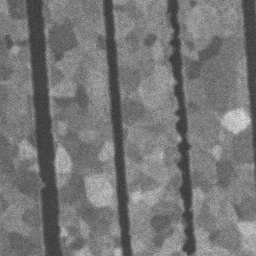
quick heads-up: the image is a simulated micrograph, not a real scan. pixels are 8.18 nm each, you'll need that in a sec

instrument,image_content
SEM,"one or a few lines or trenches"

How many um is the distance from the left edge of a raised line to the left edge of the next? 0.557